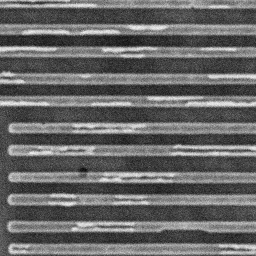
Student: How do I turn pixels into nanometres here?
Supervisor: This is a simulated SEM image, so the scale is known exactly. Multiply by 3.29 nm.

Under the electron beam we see parallel lines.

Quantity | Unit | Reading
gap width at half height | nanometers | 49.8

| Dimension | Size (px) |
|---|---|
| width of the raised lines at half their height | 10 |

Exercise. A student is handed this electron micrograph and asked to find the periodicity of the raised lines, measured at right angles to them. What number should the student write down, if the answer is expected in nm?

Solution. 80.2